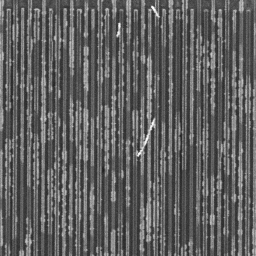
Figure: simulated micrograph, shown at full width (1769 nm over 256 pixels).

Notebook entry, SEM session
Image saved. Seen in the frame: parallel lines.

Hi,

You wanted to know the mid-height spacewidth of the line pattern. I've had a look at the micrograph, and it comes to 25.9 nanometers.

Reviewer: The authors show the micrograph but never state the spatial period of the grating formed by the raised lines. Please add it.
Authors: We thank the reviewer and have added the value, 7.05 px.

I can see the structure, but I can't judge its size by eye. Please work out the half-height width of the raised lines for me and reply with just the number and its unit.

26.8 nanometres